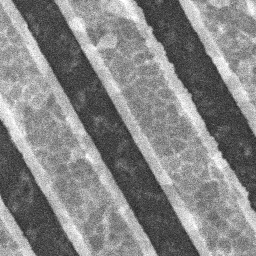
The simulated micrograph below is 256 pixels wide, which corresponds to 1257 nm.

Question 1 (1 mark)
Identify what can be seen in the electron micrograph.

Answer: one or a few lines or trenches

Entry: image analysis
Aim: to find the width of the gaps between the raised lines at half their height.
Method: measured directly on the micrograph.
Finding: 233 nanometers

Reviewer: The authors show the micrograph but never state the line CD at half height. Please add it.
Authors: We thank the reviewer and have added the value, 287 nm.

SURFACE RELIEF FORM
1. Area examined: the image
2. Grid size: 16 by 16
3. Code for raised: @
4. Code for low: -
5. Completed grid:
@---@@@@----@@@@
@----@@@@---@@@@
@@---@@@@----@@@
@@----@@@@----@@
@@@---@@@@@---@@
@@@@---@@@@----@
@@@@---@@@@@---@
@@@@@---@@@@----
-@@@@----@@@@---
--@@@@---@@@@---
--@@@@----@@@@--
---@@@@---@@@@@-
---@@@@----@@@@-
----@@@@----@@@@
@---@@@@@---@@@@
@@---@@@@----@@@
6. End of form